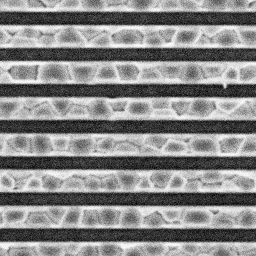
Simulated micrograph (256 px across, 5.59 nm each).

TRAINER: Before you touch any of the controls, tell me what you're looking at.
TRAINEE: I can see parallel lines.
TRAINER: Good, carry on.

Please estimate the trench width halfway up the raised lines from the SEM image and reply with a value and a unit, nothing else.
81.1 nm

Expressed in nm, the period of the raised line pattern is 202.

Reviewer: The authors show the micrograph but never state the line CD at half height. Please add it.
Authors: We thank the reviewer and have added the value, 124 nm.